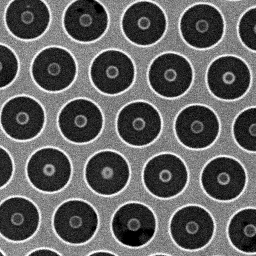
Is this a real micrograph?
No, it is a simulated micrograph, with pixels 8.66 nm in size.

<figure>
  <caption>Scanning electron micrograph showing an array of small figures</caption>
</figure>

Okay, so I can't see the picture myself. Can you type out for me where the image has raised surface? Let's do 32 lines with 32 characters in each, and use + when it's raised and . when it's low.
+.....+++....++++..++++++.++++++
+.....++.....+++....+++....++++.
+.....++......+......++.....++..
+.....++.....++......+......++..
++...++++....+++....+++.....++..
+++++++++++++++++..+++++...+++..
..+++....++++..+++++++++++++++++
..++.....+++....+++....++++...++
..++......+......++.....++.....+
..++.....++......++.....++.....+
.++++....+++....+++.....++.....+
+++++++++++++..++++....+++.....+
+...+++++..+++++++++++++++++.+++
.....+++....+++....++++...+++++.
......+......++.....++.....+++..
......+......++.....++.....++...
+....+++.....++.....++.....++...
++..+++++...+++....+++.....++...
++++++.+++++++++++++++++..++++..
.+++....++++...++++...++++++++++
..+......++.....++.....+++....++
..+......++.....++.....++......+
.+++.....++.....++.....++......+
+++++...+++....+++.....++......+
+++++++++++++++++++...++++....++
....++++...+++++..++++++++++++++
.....++.....++.....+++....++++..
.....++.....++.....++......++...
.....++.....++.....++......+....
....+++.....++.....++......++...
+++++++++.+++++...++++....+++...
++++...+++++.+++++++++++++++++..